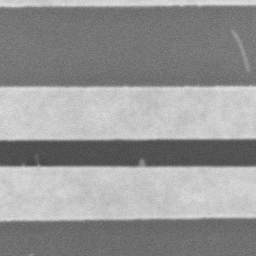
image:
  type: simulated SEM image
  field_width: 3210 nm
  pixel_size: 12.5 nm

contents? lines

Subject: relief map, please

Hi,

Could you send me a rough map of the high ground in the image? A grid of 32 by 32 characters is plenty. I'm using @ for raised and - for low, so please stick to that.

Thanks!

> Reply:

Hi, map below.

@@@@@@@@@@@@@@@@@@@@@@@@@@@@@@@@
--------------------------------
--------------------------------
--------------------------------
--------------------------------
--------------------------------
--------------------------------
--------------------------------
--------------------------------
--------------------------------
--------------------------------
@@@@@@@@@@@@@@@@@@@@@@@@@@@@@@@@
@@@@@@@@@@@@@@@@@@@@@@@@@@@@@@@@
@@@@@@@@@@@@@@@@@@@@@@@@@@@@@@@@
@@@@@@@@@@@@@@@@@@@@@@@@@@@@@@@@
@@@@@@@@@@@@@@@@@@@@@@@@@@@@@@@@
@@@@@@@@@@@@@@@@@@@@@@@@@@@@@@@@
-@------------------------------
--------------------------------
--------------------------------
--------------------------------
@@@@@@@@@@@@@@@@@@@@@@@@@@@@@@@@
@@@@@@@@@@@@@@@@@@@@@@@@@@@@@@@@
@@@@@@@@@@@@@@@@@@@@@@@@@@@@@@@@
@@@@@@@@@@@@@@@@@@@@@@@@@@@@@@@@
@@@@@@@@@@@@@@@@@@@@@@@@@@@@@@@@
@@@@@@@@@@@@@@@@@@@@@@@@@@@@@@@@
@-------------------------------
--------------------------------
--------------------------------
--------------------------------
--------------------------------